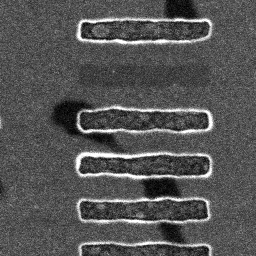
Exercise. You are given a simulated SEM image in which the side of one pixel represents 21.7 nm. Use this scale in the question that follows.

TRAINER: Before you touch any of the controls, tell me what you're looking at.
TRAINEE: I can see holes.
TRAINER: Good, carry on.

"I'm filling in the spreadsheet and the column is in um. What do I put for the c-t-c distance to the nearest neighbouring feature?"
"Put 0.981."